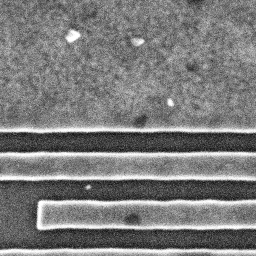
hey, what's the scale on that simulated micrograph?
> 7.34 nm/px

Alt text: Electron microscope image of wiring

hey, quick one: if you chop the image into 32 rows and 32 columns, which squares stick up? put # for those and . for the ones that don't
################################
################################
################################
################################
################################
################################
################################
################################
################################
################################
################################
################################
################################
################################
################################
################################
.....#........................##
................................
................................
################################
################################
################################
................................
................................
................................
.....###########################
.....###########################
.....###########################
.....##.........############.#..
................................
................................
################################